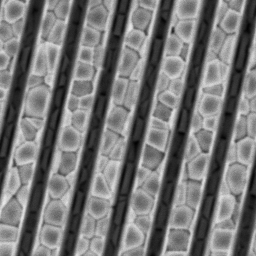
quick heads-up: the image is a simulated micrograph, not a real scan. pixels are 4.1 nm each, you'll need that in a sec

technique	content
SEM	parallel lines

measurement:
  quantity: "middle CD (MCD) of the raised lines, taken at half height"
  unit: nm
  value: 115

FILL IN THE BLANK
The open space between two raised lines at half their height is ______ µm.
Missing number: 0.0594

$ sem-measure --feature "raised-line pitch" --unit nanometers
173